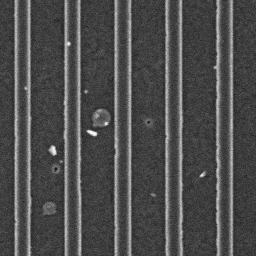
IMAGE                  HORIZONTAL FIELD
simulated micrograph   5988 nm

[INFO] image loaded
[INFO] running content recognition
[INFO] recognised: lines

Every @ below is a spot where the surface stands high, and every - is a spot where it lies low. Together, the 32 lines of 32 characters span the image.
--@@----@@----@@-----@@----@@---
--@@----@@----@@-----@@----@@---
--@@----@@----@@-----@@----@@---
--@@----@@----@@-----@@----@@---
--@@----@@----@@-----@@----@@---
--@@----@@----@@-----@@----@@---
--@@----@@----@@-----@@----@@---
--@@----@@----@@-----@@----@@---
--@@----@@----@@-----@@----@@---
--@@----@@----@@-----@@----@@---
--@@----@@----@@-----@@----@@---
--@@----@@----@@-----@@----@@---
--@@----@@----@@-----@@----@@---
--@@----@@----@@-----@@----@@---
--@@----@@--@@@@-----@@----@@---
--@@----@@--@-@@-----@@----@@---
--@@----@@----@@-----@@----@@---
--@@----@@----@@-----@@----@@---
--@@----@@----@@-----@@----@@---
--@@----@@----@@-----@@----@@---
--@@----@@----@@-----@@----@@---
--@@----@@----@@-----@@----@@---
--@@----@@----@@-----@@----@@---
--@@----@@----@@-----@@----@@---
--@@----@@----@@-----@@----@@---
--@@----@@----@@-----@@----@@---
--@@----@@----@@-----@@----@@---
--@@----@@----@@-----@@----@@---
--@@----@@----@@-----@@----@@---
--@@----@@----@@-----@@----@@---
--@@----@@----@@-----@@----@@---
--@@----@@----@@-----@@----@@---